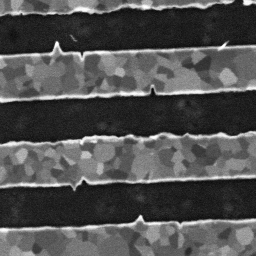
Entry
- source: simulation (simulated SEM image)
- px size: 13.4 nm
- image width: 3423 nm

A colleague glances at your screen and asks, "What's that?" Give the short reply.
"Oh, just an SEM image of one or a few lines or trenches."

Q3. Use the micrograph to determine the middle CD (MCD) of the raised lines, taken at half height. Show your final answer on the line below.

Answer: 571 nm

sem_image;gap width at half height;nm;583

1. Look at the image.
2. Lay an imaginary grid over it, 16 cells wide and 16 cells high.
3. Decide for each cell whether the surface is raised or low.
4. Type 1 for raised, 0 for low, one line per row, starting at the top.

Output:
1111111000000000
0000000000000000
0000000000000000
0111111111111111
1111111111111111
1111111111111111
0000000000000000
0000000000000000
0000000000110101
1111111111111111
1111111111111111
1111100000000000
0000000000000000
0000000000000000
1111111111111111
1111111111111111